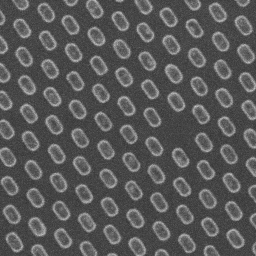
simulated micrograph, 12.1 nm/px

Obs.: a regular array of raised bodies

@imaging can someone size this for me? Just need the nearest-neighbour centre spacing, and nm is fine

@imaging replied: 336